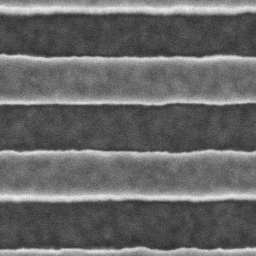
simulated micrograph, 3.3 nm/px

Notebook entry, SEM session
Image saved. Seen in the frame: lines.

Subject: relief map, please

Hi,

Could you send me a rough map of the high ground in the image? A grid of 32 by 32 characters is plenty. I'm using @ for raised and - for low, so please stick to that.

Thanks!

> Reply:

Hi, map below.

@@@@@@@@@@@@@@@@@@@@@@@@@@@@@@@@
--------------------------------
--------------------------------
--------------------------------
--------------------------------
--------------------------------
--------------------------------
@@@@@@@@@@@@@@@@@@@@@@@@@@@@@@@@
@@@@@@@@@@@@@@@@@@@@@@@@@@@@@@@@
@@@@@@@@@@@@@@@@@@@@@@@@@@@@@@@@
@@@@@@@@@@@@@@@@@@@@@@@@@@@@@@@@
@@@@@@@@@@@@@@@@@@@@@@@@@@@@@@@@
@@@@@@@@@@@@@@@@@@@@@@@@@@@@@@@@
--------------------------------
--------------------------------
--------------------------------
--------------------------------
--------------------------------
--------------------------------
@@@@@@@@@@@@@@@@@@@@@@@@@@@@@@@@
@@@@@@@@@@@@@@@@@@@@@@@@@@@@@@@@
@@@@@@@@@@@@@@@@@@@@@@@@@@@@@@@@
@@@@@@@@@@@@@@@@@@@@@@@@@@@@@@@@
@@@@@@@@@@@@@@@@@@@@@@@@@@@@@@@@
@@@@@@@@@@@@@@@@@@@@@@@@@@@@@@@@
--------------------------------
--------------------------------
--------------------------------
--------------------------------
--------------------------------
--------------------------------
@@@@@@@@@@@@@@@@@@@@@@@@@@@@@@@@